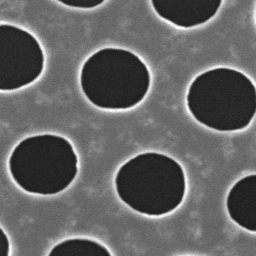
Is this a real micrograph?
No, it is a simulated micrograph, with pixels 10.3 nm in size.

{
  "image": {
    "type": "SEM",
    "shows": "holes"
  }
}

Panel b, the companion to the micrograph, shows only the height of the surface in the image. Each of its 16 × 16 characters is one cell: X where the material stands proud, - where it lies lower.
XXXXXXXXXX----XX
XXXXXXXXXXX--XXX
--XXXXXXXXXXXXXX
---XXX--XXXXXXXX
---XX----XXXX--X
-XXXX----XXX----
XXXXXX--XXXX----
XXXXXXXXXXXX----
XX--XXXXXXXXXXXX
X----XXXXXXXXXXX
X----XXX---XXXXX
X---XXX-----XXX-
XXXXXXXX---XXX--
XXXXXXXXXXXXXX--
XXXXXXXXXXXXXXXX
-XX----XXXXXXXXX